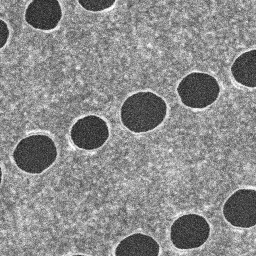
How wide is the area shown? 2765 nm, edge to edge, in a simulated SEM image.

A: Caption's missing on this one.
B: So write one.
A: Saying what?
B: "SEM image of holes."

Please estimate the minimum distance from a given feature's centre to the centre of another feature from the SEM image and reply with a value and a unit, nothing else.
0.632 um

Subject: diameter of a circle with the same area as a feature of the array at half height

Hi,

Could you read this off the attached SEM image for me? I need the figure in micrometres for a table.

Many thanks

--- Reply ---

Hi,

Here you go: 0.426